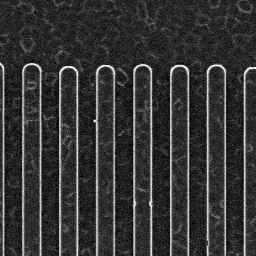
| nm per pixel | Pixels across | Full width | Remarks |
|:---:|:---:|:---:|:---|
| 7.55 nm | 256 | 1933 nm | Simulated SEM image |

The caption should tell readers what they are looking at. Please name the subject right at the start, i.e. parallel lines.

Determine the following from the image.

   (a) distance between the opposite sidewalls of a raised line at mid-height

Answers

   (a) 135 nm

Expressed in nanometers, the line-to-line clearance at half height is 142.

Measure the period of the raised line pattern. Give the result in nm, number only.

279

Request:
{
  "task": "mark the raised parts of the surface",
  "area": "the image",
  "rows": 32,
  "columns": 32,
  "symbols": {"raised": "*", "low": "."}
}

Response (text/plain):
................................
................................
................................
................................
................................
................................
................................
................................
...**...*....*...**...*...**....
...**...**..**...**..**...**...*
...**...**..**...**..**...**...*
...**...**..**...**..**...**...*
...**...**..**...**..**...**...*
...**..***..**...**..**...**...*
...**...**..**...**..**...**...*
...**...**..**...**..**...**...*
...**...**..**...**..**...**...*
...**...**..**...**..**...**...*
...**...**..**...**..**...**...*
...**...**..**...**..**...**...*
...**...**..**...**..**...**...*
...**...**..**...**..**...**...*
...**...**..**...**..**...**...*
...**...**..**...**..**...**...*
...**...**..**...**..**...**...*
...**...**..**...**..**...**...*
...**...**..**...**..**...**...*
...**...**..**...**..**...**...*
...**...**..**...**..**...**...*
...**...**..**...**..**...**...*
...**...**..**...**..**...**...*
...**...**..**...**..**...**...*